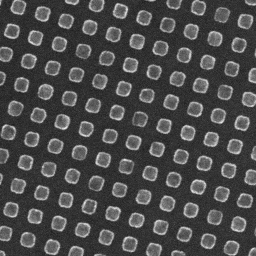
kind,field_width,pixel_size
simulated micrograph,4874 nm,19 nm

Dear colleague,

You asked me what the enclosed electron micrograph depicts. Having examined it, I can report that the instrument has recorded a regular array of raised bodies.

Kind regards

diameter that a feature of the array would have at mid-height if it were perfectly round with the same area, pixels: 14.8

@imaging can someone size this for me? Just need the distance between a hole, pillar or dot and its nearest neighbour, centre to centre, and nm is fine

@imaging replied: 462